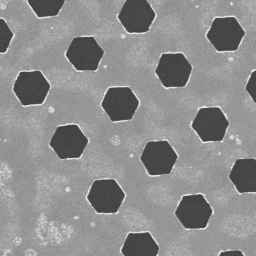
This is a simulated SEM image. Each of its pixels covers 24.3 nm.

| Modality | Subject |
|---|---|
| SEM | a regular array of holes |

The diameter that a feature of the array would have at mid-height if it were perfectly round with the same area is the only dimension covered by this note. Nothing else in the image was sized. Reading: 855 nanometres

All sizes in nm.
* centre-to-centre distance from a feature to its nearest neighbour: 1540